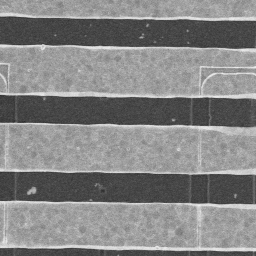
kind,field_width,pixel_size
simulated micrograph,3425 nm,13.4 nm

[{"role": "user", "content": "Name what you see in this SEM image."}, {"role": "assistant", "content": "wiring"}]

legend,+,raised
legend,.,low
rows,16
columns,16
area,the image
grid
++++++++++++++++
................
................
++++++++++++++++
++++++++++++++++
++++++++++++++++
................
................
++++++++++++++++
++++++++++++++++
++++++++++++++++
................
................
++++++++++++++++
++++++++++++++++
.......+.+++++++